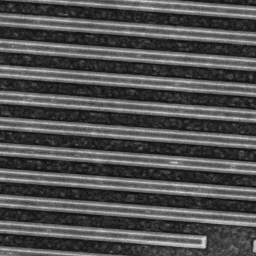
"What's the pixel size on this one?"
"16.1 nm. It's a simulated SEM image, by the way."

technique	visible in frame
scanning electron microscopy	parallel lines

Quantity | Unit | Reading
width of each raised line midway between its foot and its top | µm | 0.155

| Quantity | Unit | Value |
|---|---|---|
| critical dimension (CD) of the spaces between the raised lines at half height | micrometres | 0.263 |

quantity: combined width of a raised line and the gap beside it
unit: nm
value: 417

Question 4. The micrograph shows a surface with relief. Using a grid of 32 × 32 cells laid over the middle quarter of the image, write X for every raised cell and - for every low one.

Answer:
--------------------------------
--------------------------------
XXXXXXXXX-----------------------
XXXXXXXXXXXXXXXXXXXXXX----------
---XX-XXXXXXXXXXXXXXXXXXXXXXXXXX
------------------XXXXXXXXXXXXXX
------------------------------XX
--------------------------------
XXX-----------------------------
XXXXXXXXXXXXXXXX----------------
XXXXXXXXXXXXXXXXXXXXXXXXXXXXX---
-------------XXXXXXXXXXXXXXXXXXX
--------------------------XXXXXX
--------------------------------
--------------------------------
XXXXXXXXX-----------------------
XXXXXXXXXXXXXXXXXXXXXX----------
---XXXXXXXXXXXXXXXXXXXXXXXXXXXXX
----------------XXXXXXXXXXXXXXXX
--------------------------------
--------------------------------
XX------------------------------
XXXXXXXXXXXXXXX-----------------
XXXXXXXXXXXXXXXXXXXXXXXXXXXX----
------------XXXXXXXXXXXXXXXXXXXX
-------------------------XXXXXXX
--------------------------------
--------------------------------
XXXXXXXX------------------------
XXXXXXXXXXXXXXXXXXXXXX----------
------XXXXXXXXXXXXXXXXXXXXXXXXXX
-------------------XXXXXXXXXXXXX